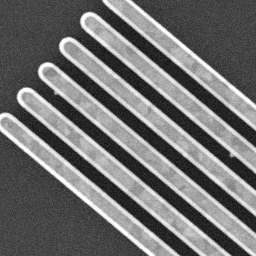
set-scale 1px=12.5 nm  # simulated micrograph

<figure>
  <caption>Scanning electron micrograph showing groups of lines, slits or small figures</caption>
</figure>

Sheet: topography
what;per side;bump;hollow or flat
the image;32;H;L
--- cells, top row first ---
LLLLLLLLLLLLLHHHHLLLLLLLLLLLLLLL
LLLLLLLLLLLLLLLHHHLLLLLLLLLLLLLL
LLLLLLLLLLHHHLLLHHHLLLLLLLLLLLLL
LLLLLLLLLLLHHHLLLHHHLLLLLLLLLLLL
LLLLLLLLLLLLHHHLLLHHHLLLLLLLLLLL
LLLLLLLLHHLLLHHHLLLHHHHLLLLLLLLL
LLLLLLLLHHHLLLHHHLLLLHHHLLLLLLLL
LLLLLLLLLHHHLLLHHHHLLLHHHLLLLLLL
LLLLLHHLLLHHHLLLLHHHLLLHHHLLLLLL
LLLLLHHHLLLHHHHLLLHHHLLLHHHLLLLL
LLLLLLHHHLLLLHHHLLLHHHLLLHHHHLLL
LLLHLLLHHHHLLLHHHLLLHHHLLLLHHHLL
LLHHHLLLLHHHLLLHHHLLLHHHHLLLHHHL
LLLHHHHLLLHHHLLLHHHLLLLHHHLLLHHH
HLLLLHHHLLLHHHLLLHHHLLLLHHHLLLHH
HHHLLLHHHLLLHHHLLLLHHHLLLHHHLLLH
LHHHLLLHHHLLLHHHHLLLHHHLLLHHHLLL
LLHHHLLLHHHLLLLHHHLLLHHHLLLHHHLL
LLLHHHLLLHHHHLLLHHHLLLHHHLLLHHHH
LLLLHHHLLLLHHHLLLHHHLLLHHHLLLLHH
LLLLLHHHLLLLHHHLLLHHHLLLHHHHLLLH
LLLLLLLHHHLLLHHHLLLHHHLLLLHHHLLL
LLLLLLLLHHHLLLHHHLLLHHHHLLLHHHLL
LLLLLLLLLHHHLLLHHHLLLLHHHLLLHHHL
LLLLLLLLLLHHHLLLHHHHLLLHHHLLLHHH
LLLLLLLLLLLHHHLLLLHHHLLLHHHLLLHH
LLLLLLLLLLLLLHHHLLLHHHLLLHHHLLLL
LLLLLLLLLLLLLLHHHLLLHHHLLLHHHHLL
LLLLLLLLLLLLLLLHHHLLLHHHLLLLHHHL
LLLLLLLLLLLLLLLLHHHLLLHHHHLLLHHH
LLLLLLLLLLLLLLLLLHHHLLLLHHHLLLHH
LLLLLLLLLLLLLLLLLLHHHHLLLHHHLLLH